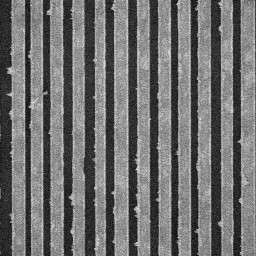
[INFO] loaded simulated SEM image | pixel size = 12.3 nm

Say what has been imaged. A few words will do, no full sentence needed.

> parallel lines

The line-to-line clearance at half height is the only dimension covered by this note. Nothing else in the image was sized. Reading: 0.11 µm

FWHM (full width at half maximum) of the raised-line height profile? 146 nm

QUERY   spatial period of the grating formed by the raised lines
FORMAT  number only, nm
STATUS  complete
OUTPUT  256